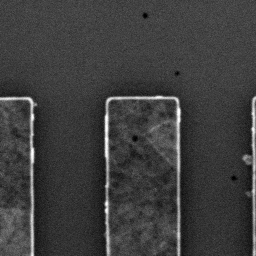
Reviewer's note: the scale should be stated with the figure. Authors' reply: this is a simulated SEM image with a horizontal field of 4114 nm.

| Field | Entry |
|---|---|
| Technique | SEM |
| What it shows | wiring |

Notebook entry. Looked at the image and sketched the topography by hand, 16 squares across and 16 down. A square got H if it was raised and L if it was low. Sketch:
LLLLLLLLLLLLLLLL
LLLLLLLLLLLLLLLL
LLLLLLLLLLLLLLLL
LLLLLLLLLLLLLLLL
LLLLLLLLLLLLLLLL
LLLLLLLLLLLLLLLL
HHLLLLLHHHHLLLLL
HHLLLLLHHHHLLLLL
HHLLLLLHHHHLLLLL
HHLLLLLHHHHLLLLL
HHLLLLLHHHHLLLLL
HHLLLLLHHHHLLLLL
HHLLLLLHHHHLLLLL
HHLLLLLHHHHLLLLL
HHLLLLLHHHHLLLLL
HHLLLLLHHHHLLLLL